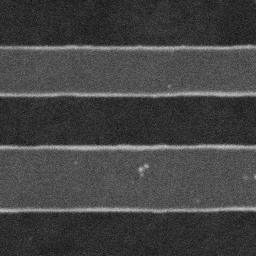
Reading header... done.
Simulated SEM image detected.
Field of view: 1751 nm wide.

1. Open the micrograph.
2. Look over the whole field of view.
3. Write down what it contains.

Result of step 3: lines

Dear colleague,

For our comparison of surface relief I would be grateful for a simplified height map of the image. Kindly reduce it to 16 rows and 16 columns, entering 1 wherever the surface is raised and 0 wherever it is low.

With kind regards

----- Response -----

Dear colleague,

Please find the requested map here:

0000000000000000
0000000000000000
0000000000000000
1111111111111111
1111111111111111
1111111111111111
0000000000000000
0000000000000000
0000000000000000
1111111111111111
1111111111111111
1111111111111111
1111111111111111
0000000000000000
0000000000000000
0000000000000000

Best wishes